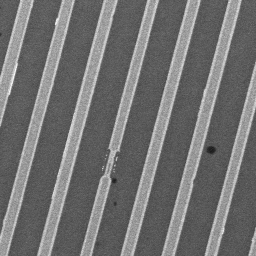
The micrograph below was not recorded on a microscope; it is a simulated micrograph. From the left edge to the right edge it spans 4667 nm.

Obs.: parallel lines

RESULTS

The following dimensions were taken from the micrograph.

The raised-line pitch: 736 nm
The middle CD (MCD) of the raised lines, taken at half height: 10.2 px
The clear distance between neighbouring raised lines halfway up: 555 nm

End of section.